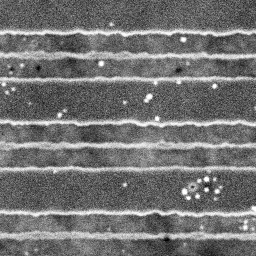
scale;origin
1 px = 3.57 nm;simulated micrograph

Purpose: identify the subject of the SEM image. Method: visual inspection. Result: lines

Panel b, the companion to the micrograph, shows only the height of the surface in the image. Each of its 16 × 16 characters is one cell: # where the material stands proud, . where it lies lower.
################
################
................
................
................
################
################
################
................
................
...##.....#####.
################
################
................
................
................